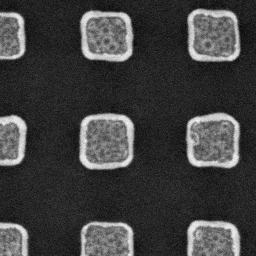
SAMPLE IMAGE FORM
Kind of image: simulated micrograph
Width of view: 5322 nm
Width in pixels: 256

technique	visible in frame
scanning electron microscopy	raised bodies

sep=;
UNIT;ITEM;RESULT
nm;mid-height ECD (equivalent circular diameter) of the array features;1080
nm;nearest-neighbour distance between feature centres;2190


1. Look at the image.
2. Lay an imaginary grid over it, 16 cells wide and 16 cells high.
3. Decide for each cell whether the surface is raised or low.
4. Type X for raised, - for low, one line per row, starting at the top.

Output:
----------------
X----XXX----XXX-
X----XXX----XXX-
X-----XX----XXX-
----------------
----------------
----------------
X-----XX----XX--
X----XXX----XXX-
X----XXX----XXX-
----------------
----------------
----------------
----------------
X----XXX----XXX-
XX---XXX----XXX-